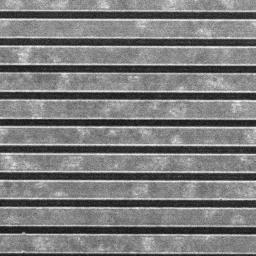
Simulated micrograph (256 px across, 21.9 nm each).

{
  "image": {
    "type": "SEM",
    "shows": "parallel lines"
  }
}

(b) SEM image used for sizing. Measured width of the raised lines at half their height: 19 px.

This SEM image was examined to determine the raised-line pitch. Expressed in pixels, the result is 26.9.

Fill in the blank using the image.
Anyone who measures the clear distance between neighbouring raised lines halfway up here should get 175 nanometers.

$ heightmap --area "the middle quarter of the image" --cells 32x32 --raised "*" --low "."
................................
................................
******..........................
********************************
********************************
********************************
********************************
................................
................................
********************************
********************************
********************************
********************************
......**************************
................................
................................
********************************
********************************
********************************
********************************
................................
................................
******..........................
********************************
********************************
********************************
********************************
................................
................................
********************************
********************************
********************************